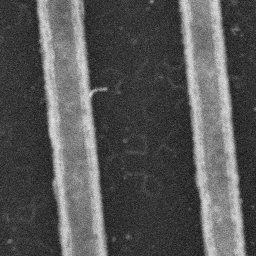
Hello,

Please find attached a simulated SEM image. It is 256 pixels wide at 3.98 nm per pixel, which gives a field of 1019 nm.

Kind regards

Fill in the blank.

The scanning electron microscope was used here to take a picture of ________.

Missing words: one or a few lines or trenches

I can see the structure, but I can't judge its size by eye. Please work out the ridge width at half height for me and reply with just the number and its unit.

0.136 microns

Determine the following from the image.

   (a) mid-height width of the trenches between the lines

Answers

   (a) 423 nm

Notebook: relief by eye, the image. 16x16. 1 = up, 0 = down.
0001100000001000
0001100000001100
0001100000001100
0001100000001100
0001100000001100
0001100000001100
0001100000001100
0001110000001100
0001110000001100
0000110000001100
0000110000000110
0000110000000110
0000110000000110
0000110000000110
0000110000000110
0000110000000110